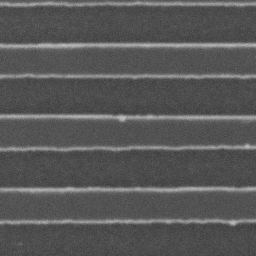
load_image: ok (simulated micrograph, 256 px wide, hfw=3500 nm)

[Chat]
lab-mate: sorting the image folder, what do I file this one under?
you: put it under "lines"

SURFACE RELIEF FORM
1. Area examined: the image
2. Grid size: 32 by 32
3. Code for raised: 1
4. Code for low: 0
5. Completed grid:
11111111111111111001111111111111
00000000000000000000000000000000
00000000000000000000000000000000
00000000000000000000000000000000
00000000000000000000000000000000
00000000000000000000000000000000
11111111111111111111111111111111
11111111111111111111111111111111
11111111111111111111111111111111
11100101111111111111111111111111
00000000000000000000000000000000
00000000000000000000000000000000
00000000000000000000000000000000
00000000000000000000000000000000
11111111111111110000000000000000
11111111111111111111111111111111
11111111111111111111111111111111
11111111111111111111111111111111
11111111111111111111111111111011
00000000000000000000000000000000
00000000000000000000000000000000
00000000000000000000000000000000
00000000000000000000000000000000
00000000000000000000000000000000
11111111111111111111111111111111
11111111111111111111111111111111
11111111111111111111111111111111
11111111111111111111111111111111
00000000000000000000000000000000
00000000000000000000000000000000
00000000000000000000000000000000
00000000000000000000000000000000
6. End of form